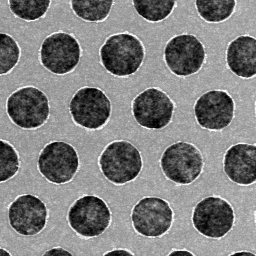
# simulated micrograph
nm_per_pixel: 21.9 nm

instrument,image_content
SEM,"a regular array of holes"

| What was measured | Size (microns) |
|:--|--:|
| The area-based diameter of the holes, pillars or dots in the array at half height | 0.898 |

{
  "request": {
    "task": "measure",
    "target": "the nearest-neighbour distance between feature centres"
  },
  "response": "1350 nanometres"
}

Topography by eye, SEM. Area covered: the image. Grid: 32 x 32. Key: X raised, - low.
X-----XXX-----XXX-----XX-----XXX
XX----XXX-----XXX----XXXX----XXX
XXX-XXXXXXX--XXXXXX-XXXXXX--XXXX
XXXXXXXXXXXXXXXXXXXXXXXXXXXXXXXX
-XXXXX---XXXXX---XXXXX--XXXXXX-X
--XXX-----XXX-----XXX----XXXX---
--XXX-----XXX-----XXX-----XX----
--XXX-----XXX-----XXX----XXX----
--XXXX---XXXX----XXXX----XXXX---
XXXXXXXXXXXXXXXXXXXXXXXXXXXXXX-X
XXXXXXXXXXXXXXXXXXXXXXXXXXXXXXXX
XX---XXXXX---XXXXX--XXXXXX--XXXX
X-----XXX-----XXX----XXXX----XXX
X-----XXX-----XXX-----XX-----XXX
X-----XXX-----XXX----XXX-----XXX
XX---XXXXX---XXXX----XXXX----XXX
XXXXXXXXXXXXXXXXXXXXXXXXXXXXXXXX
XXXXXXXXXXXXXXXXXXXXXXXXXXXXXXXX
--XXXX---XXXX----XXXX----XXXX---
--XXX-----XXX-----XX-----XXX----
--XXX-----XX------XX-----XXX----
--XXX----XXXX----XXX-----XXX----
-XXXXX---XXXXX--XXXXX---XXXXX---
XXXXXXXXXXXXXXXXXXXXXXXXXXXXXXXX
XXX-XXXXXXXXXXXXXXXXXXXXXXXXXXXX
X-----XXX----XXXX----XXXX----XXX
X-----XXX-----XX-----XXX-----XXX
X-----XXX-----XXX----XXX-----XXX
XX---XXXX----XXXX----XXX-----XXX
XXXXXXXXXX--XXXXXXX-XXXXXX--XXXX
XXXXXXXXXXXXXXXXXXXXXXXXXXXXXXXX
-XXXXX---XXXXX--XXXXXX--XXXXXX-X